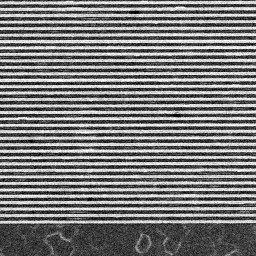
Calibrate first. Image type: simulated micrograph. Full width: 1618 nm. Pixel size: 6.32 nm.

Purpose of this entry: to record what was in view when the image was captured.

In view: parallel lines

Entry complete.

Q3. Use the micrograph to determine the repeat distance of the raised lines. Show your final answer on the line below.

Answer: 40.7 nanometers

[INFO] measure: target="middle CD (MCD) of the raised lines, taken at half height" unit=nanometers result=15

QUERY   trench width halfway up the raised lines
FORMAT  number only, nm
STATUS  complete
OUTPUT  26.1